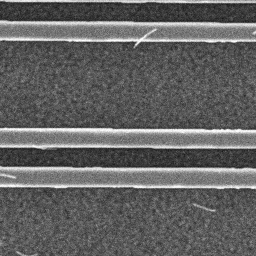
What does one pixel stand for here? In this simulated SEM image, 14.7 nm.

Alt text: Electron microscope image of lines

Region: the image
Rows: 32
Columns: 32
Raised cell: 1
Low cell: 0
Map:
00000000000000000000000000000000
00000000000000000000000000000000
00000000000000000000000000000000
11111111111111111111111111111111
11111111111111111111111111111111
00000000000000000000000000000000
00000000000000000000000000000000
00000000000000000000000000000000
00000000000000000000000000000000
00000000000000000000000000000000
00000000000000000000000000000000
00000000000000000000000000000000
00000000000000000000000000000000
00000000000000000000000000000000
00000000000000000000000000000000
00000000000000000000000000000000
11111111111111111111111111111111
11111111111111111111111111111111
00000000000000000000000000000000
00000000000000000000000000000000
00000000000000000000000000000000
11111111111111111111111111111111
11111111111111111111111111111111
00000000000000000000000000000000
00000000000000000000000000000000
00000000000000000000000000000000
00000000000000000000000000000000
00000000000000000000000000000000
00000000000000000000000000000000
00000000000000000000000000000000
00000000000000000000000000000000
00000000000000000000000000000000